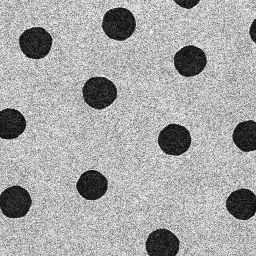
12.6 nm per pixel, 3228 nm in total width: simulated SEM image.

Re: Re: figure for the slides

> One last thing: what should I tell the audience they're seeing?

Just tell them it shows holes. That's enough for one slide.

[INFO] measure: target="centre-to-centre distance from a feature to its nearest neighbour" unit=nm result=1010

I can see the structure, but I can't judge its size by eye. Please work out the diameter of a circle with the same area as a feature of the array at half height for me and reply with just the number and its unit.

0.411 um